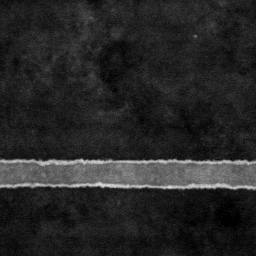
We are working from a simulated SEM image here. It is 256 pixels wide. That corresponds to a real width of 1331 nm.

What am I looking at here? one or a few lines or trenches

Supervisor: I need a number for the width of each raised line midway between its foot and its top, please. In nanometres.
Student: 130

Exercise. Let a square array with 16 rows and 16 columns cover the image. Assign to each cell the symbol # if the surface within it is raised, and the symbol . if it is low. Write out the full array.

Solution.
................
................
................
................
................
................
................
................
................
................
################
################
................
................
................
................